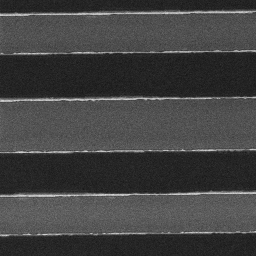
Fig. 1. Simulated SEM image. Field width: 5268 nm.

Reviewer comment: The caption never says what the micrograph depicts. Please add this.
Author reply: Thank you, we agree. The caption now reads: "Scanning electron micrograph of lines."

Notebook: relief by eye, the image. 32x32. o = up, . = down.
oooooooooooooooooooooooooooooooo
oooooooooooooooooooooooooooooo..
................................
................................
................................
................................
....................oooooooooooo
oooooooooooooooooooooooooooooooo
oooooooooooooooooooooooooooooooo
oooooooooooooooooooooooooooooooo
oooooooooooooooooooooooooooooooo
oooooooooooooooooooooooooooooooo
ooooooooo.......................
................................
................................
................................
................................
................................
................................
oooooooooooooooooooooooooooooooo
oooooooooooooooooooooooooooooooo
oooooooooooooooooooooooooooooooo
oooooooooooooooooooooooooooooooo
oooooooooooooooooooooooooooooooo
................................
................................
................................
................................
................................
oooooooooooooooooooooooooooooooo
oooooooooooooooooooooooooooooooo
oooooooooooooooooooooooooooooooo